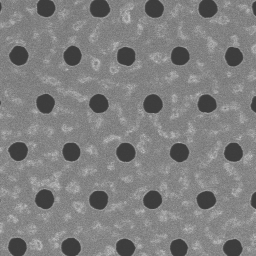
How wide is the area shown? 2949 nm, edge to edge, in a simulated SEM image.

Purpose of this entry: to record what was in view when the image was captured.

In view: a regular array of holes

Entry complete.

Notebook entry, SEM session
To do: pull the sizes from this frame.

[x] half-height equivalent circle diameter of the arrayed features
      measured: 218 nm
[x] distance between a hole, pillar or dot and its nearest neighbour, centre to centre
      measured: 618 nm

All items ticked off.